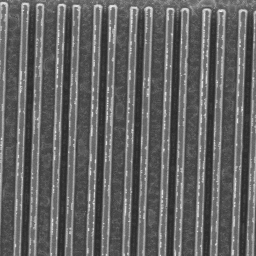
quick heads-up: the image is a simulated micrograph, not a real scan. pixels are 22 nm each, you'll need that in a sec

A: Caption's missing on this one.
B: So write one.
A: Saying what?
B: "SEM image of parallel lines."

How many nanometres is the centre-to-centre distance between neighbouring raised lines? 397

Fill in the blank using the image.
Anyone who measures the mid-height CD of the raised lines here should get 143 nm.